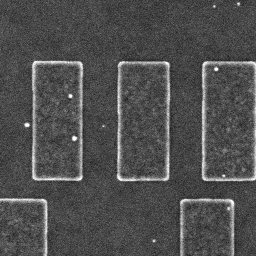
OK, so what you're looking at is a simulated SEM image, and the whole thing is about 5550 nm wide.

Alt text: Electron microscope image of wiring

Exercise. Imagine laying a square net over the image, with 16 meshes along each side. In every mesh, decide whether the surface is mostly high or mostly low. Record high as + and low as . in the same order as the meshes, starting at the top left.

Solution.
................
................
................
................
..+++..++++..+++
..+++..++++..+++
..+++..++++..+++
..+++..++++..+++
..+++..++++..+++
..+++..++++..+++
..+++..++++..+++
................
++..........++..
+++........++++.
+++........++++.
+++........++++.